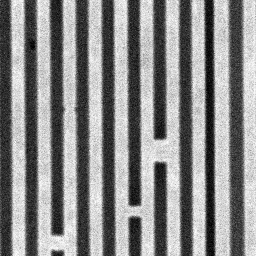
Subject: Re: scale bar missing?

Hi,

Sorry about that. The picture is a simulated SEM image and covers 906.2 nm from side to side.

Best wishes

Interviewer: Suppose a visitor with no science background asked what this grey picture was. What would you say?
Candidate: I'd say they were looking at parallel lines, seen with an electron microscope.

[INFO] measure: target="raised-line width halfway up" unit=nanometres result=52.2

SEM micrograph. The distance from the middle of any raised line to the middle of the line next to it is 90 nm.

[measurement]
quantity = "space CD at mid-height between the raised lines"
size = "39.8 nanometres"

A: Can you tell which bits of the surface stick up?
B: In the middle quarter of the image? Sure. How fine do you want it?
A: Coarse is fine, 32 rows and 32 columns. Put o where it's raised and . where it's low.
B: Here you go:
ooo...oooo..oooo...ooo...oooo...
ooo...oooo..oooo...ooo....ooo...
ooo...oooo..oooo...ooo....ooo...
ooo...oooo..oooo...ooo....ooo...
ooo...oooo..oooo...ooo....ooo...
ooo...oooo...ooo...ooo....ooo...
ooo...oooo...ooo...ooo....ooo...
ooo...ooo....ooo...ooo....ooo...
ooo...ooo....ooo...ooo....ooo...
ooo...ooo....ooo...ooo....ooo...
ooo...ooo....ooo...ooo....ooo...
ooo...ooo....ooo...ooo....ooo...
ooo...ooo....ooo...ooo....ooo...
ooo...ooo....ooo...ooo....ooo...
ooo...oooo...ooo...oooo...ooo...
ooo...oooo...ooo...oooo...ooo...
ooo...oooo...ooo...oooo...ooo...
ooo...oooo...ooo...oooo...ooo...
ooo...oooo...ooo...oooo..oooo...
ooo...oooo...ooo...oooooooooo...
ooo...oooo...ooo...oooooooooo...
ooo...oooo...ooo...oooooooooo...
ooo...oooo...ooo...oooooooooo...
ooo...oooo...ooo...oooooooooo...
ooo...oooo...ooo...oooooooooo...
ooo...oooo...ooo...oooo...ooo...
ooo...oooo...ooo...oooo...ooo...
ooo...oooo...ooo...oooo...ooo...
ooo...oooo...ooo...oooo...ooo...
ooo...oooo...ooo...oooo...ooo...
ooo...oooo...ooo...oooo...ooo...
ooo...oooo...ooo...oooo...ooo...